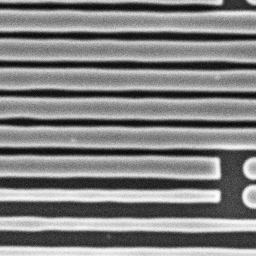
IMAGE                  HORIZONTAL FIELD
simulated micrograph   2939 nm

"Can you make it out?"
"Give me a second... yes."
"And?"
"groups of lines, slits or small figures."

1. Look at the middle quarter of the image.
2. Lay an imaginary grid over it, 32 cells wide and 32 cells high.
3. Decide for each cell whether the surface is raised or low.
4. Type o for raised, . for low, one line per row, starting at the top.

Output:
................................
oooooooo........................
oooooooooooooooooooooooooooooooo
oooooooooooooooooooooooooooooooo
oooooooooooooooooooooooooooooooo
oooooooooooooooooooooooooooooooo
................................
................................
................................
oooooooooooooooooooooooooooooooo
oooooooooooooooooooooooooooooooo
oooooooooooooooooooooooooooooooo
oooooooooooooooooooooooooooooooo
...........ooooo...ooooooooooooo
................................
................................
oooooooooooooooooooooooooooooooo
oooooooooooooooooooooooooooooooo
oooooooooooooooooooooooooooooooo
oooooooooooooooooooooooooooooooo
oooooooooooooooooooooooooooooooo
................................
................................
oooooooooooooooooooooooooooo....
oooooooooooooooooooooooooooooooo
oooooooooooooooooooooooooooooooo
oooooooooooooooooooooooooooooooo
oooooooooooooooooooooooooooooooo
................................
................................
................................
................................